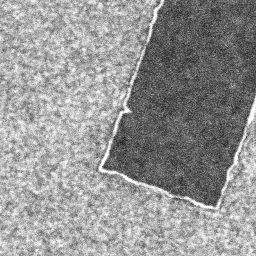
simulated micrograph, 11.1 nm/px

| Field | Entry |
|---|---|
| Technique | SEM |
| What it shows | one or a few lines or trenches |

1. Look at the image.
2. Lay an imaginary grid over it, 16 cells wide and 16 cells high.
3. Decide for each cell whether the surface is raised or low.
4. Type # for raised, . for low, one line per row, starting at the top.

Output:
..........######
.........#######
.........#######
.........#######
........########
........########
........########
.......#########
.......########.
.......########.
.......#######..
.........#####..
............##..
................
................
................